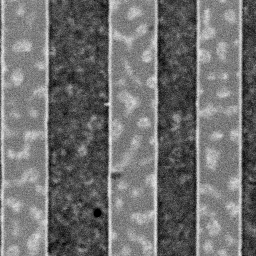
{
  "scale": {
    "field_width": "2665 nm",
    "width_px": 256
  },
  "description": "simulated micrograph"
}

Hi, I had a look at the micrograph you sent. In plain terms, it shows one or a few lines or trenches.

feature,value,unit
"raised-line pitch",1010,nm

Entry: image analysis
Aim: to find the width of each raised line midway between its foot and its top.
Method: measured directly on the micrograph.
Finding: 0.471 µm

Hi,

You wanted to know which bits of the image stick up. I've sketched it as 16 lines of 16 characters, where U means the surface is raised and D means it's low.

UUUDDDDUUUDDUUUD
UUUDDDDUUUDDUUUD
UUUDDDDUUUDDUUUD
UUUDDDDUUUDDUUUD
UUUDDDDUUUDDUUUD
UUUDDDDUUUDDUUUD
UUUDDDDUUUDDUUUD
UUUDDDDUUUDDUUUD
UUUDDDDUUUDDUUUD
UUUDDDDUUUDDUUUD
UUUDDDDUUUDDUUUD
UUUDDDDUUUDDUUUD
UUUDDDDUUUDDUUUD
UUUDDDDUUUDDUUUD
UUUDDDDUUUDDUUUD
UUUDDDDUUUDDUUUD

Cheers